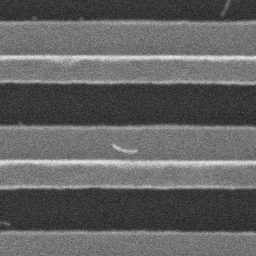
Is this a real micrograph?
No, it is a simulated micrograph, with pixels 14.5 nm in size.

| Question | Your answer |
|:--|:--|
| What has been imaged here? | lines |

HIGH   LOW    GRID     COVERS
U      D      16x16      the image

DDDDDDDDDDDDDDDD
UUUUUUUUUUUUUUUU
UUUUUUUUUUUUUUUU
UUUUUUUUUUUUUUUU
UUUUUUUUUUUUUUUU
DDDDDDDDDDDDDDDD
DDDDDDDDDDDDDDDD
DDDDDDDDDDDDDDDD
UUUUUUUUUUUUUUUU
UUUUUUUUUUUUUUUU
UUUUUUUUUUUUUUUU
UUUUUUUUUUUUUUUU
DDDDDDDDDDDDDDDD
DDDDDDDDDDDDDDDD
DDDDDDDDDDDDDDDD
UUUUUUUUUUUUUUUU